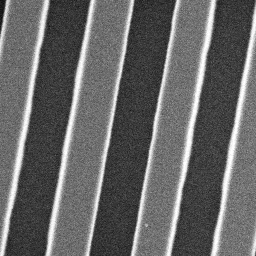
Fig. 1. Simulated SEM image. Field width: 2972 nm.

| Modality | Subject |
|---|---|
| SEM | lines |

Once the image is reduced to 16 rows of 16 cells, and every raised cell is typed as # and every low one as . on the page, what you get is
###...##...##...
###..###...##...
###..###...##...
##...###..###...
##...###..###..#
##...##...##...#
##...##...##...#
##..###...##...#
#...###...##...#
#...###..###..##
#...###..###..##
#...##...##...##
#...##...##...##
#..###...##...##
...###..###...##
...###..###..###